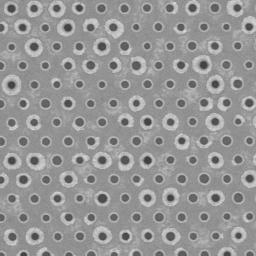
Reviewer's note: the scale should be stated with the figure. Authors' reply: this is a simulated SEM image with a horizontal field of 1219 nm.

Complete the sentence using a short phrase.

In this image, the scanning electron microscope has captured a regular array of holes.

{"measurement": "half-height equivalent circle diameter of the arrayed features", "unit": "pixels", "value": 8.53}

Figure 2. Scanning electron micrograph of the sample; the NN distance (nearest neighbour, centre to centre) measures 104 nm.